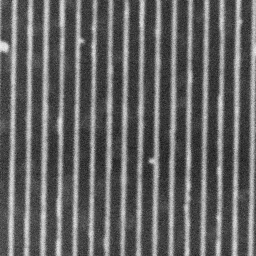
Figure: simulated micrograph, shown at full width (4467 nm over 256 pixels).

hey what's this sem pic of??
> parallel lines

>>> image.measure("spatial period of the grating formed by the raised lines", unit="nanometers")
279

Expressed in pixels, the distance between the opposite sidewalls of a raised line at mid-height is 3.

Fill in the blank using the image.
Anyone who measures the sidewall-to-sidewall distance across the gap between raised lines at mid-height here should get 13.1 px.